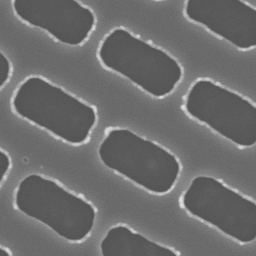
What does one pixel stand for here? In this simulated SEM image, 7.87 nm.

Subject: holes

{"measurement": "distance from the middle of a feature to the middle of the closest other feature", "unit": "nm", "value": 764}